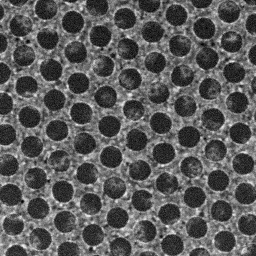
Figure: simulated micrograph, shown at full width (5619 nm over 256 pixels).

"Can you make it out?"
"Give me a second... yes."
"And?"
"a regular array of holes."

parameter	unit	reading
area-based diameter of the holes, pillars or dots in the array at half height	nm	508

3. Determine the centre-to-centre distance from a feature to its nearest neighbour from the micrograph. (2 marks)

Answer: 649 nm